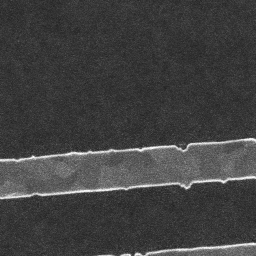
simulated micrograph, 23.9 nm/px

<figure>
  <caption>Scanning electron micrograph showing one or a few lines or trenches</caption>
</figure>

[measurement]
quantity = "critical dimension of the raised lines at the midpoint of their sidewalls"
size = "903 nanometers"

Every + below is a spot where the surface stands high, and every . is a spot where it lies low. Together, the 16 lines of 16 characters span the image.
................
................
................
................
................
................
................
................
................
......++++++++++
++++++++++++++++
++++++++++++....
................
................
................
.............+++